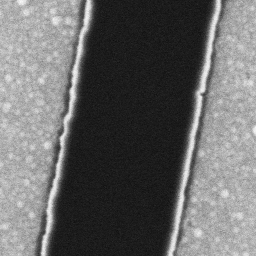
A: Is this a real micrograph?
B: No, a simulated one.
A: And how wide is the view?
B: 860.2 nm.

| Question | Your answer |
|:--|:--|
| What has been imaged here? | one or a few lines or trenches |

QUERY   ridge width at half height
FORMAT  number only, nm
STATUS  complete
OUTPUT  435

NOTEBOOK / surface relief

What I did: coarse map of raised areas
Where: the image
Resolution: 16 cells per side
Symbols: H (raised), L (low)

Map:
LLLLLHHHHHHHHHLL
LLLLLHHHHHHHHLLL
LLLLLHHHHHHHHLLL
LLLLLHHHHHHHHLLL
LLLLLHHHHHHHHLLL
LLLLLHHHHHHHHLLL
LLLLHHHHHHHHHLLL
LLLLHHHHHHHHLLLL
LLLLHHHHHHHHLLLL
LLLLHHHHHHHHLLLL
LLLLHHHHHHHHLLLL
LLLHHHHHHHHHLLLL
LLLHHHHHHHHLLLLL
LLLHHHHHHHHLLLLL
LLLHHHHHHHHLLLLL
LLLHHHHHHHHLLLLL